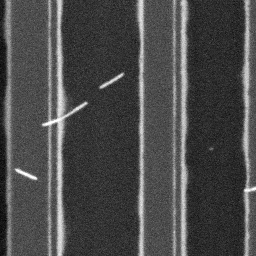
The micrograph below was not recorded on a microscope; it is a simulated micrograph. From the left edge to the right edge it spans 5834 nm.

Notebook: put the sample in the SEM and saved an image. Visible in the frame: lines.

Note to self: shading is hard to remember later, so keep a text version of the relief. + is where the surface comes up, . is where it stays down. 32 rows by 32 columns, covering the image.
.++++++...........+++++........+
.++++++...........+++++........+
.++++++...........+++++........+
.++++++...........+++++........+
.++++++...........+++++........+
.++++++...........+++++........+
.++++++...........+++++........+
.++++++...........+++++........+
.++++++...........+++++........+
.++++++...........+++++........+
.++++++...........+++++........+
.++++++...........+++++........+
.++++++...........+++++........+
.++++++...........+++++........+
.+++++++..........+++++........+
.++++++...........+++++........+
.++++++...........+++++........+
.++++++...........+++++........+
.++++++...........+++++........+
.++++++...........+++++........+
.++++++...........+++++........+
.++++++...........+++++........+
.++++++...........+++++........+
.++++++...........+++++........+
.++++++...........+++++........+
.++++++...........+++++........+
.++++++...........+++++........+
.++++++...........+++++........+
.++++++...........+++++........+
.++++++...........+++++........+
.++++++...........+++++........+
.++++++...........+++++........+